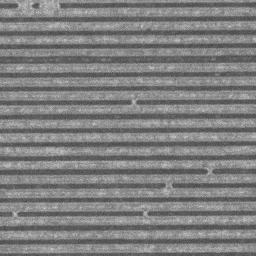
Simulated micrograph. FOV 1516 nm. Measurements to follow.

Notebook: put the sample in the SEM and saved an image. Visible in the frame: parallel lines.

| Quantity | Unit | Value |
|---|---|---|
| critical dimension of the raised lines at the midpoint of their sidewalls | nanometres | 46.6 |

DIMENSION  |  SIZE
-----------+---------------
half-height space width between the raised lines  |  5.88 pixels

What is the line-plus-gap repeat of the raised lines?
82.3 nm